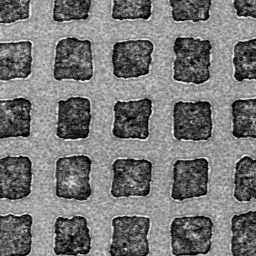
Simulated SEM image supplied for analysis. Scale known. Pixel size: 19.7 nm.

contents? a regular array of holes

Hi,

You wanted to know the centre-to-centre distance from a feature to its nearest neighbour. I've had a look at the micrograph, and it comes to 1150 nm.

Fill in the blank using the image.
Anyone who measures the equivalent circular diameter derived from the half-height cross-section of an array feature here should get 0.843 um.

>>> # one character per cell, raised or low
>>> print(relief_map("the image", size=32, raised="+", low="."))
....+++....+++.....++.....+++...
....++.....+++.....++.....+++...
..+++++...+++++.++++++....++++++
++++++++++++++++++++++++++++++++
++++++++++++++++++++++++++++++++
....+++....+++.....+++....+++...
....+++.....++.....+++....+++...
....+++.....++.....+++....+++...
....+++.....++.....+++....+++...
....+++.....++....++++....+++...
++++++++++++++++++++++++.+++++++
++++++++++++++++++++++++++++++++
...+++++...++++++..+++++++++++..
....+++....+++.....+++....+++...
....+++....+++.....+++.....++...
....+++....+++.....+++.....++...
....+++....+++.....+++.....++...
++++++++.++++++++++++++...++++++
++++++++++++++++++++++++++++++++
+..+++++...+++++++++++++++++++.+
....+++....+++.....+++....++++..
....+++....+++.....+++....+++...
....+++....+++.....+++....+++...
....+++....+++.....++.....+++...
...++++....+++....+++....++++...
++++++++++++++++++++++++++++++++
+++++++++++++++++++++++++++++++.
....+++....+++.....+++....+++...
....+++....+++.....++......++...
....+++....+++....+++......++...
....+++....+++.....++.....+++...
....+++....+++.....++.....+++...